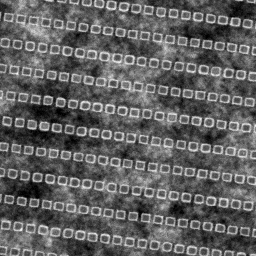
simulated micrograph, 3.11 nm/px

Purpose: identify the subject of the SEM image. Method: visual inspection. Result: a regular array of raised bodies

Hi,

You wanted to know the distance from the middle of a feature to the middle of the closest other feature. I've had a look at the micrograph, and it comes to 0.0386 um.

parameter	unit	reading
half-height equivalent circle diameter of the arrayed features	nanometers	28.9